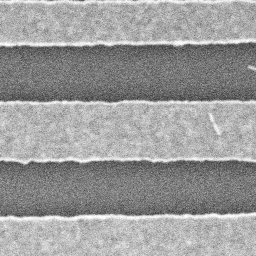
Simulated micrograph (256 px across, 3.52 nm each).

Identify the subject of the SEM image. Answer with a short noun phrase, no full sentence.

lines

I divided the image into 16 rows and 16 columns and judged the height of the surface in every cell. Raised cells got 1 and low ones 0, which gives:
1111111111111111
1111111111111111
1111111111111111
0000000000000000
0000000000000000
0000000000000000
1111111111111111
1111111111111111
1111111111111111
1111111111111111
0000000000000000
0000000000000000
0000000000000000
0000011101111111
1111111111111111
1111111111111111